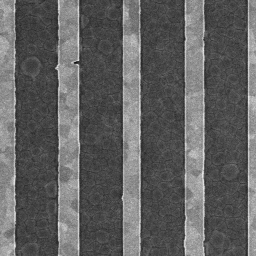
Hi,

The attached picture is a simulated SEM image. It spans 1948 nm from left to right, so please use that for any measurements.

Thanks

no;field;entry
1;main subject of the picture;one or a few lines or trenches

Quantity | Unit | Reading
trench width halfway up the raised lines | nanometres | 335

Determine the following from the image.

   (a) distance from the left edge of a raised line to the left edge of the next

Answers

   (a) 479 nanometres